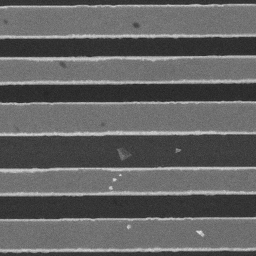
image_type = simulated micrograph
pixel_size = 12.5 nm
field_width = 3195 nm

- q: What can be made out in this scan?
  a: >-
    lines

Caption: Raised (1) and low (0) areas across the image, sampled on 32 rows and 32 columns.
00000000000000000000000000000000
11111111111111111111111111111111
11111111111111111111111111111111
11111111111111111111111111111111
11111111111111111111111111111111
00000000000000000000000000000000
00000000000000000000000000000000
11111111111111111111111111111111
11111111111111111111111111111111
11111111111111111111111111111111
11111111111110000000000000000000
00000000000000000000000000000000
00000000000000000000000000000000
11111111111111111111111111111111
11111111111111111111111111111111
11111111111111111111111111111111
11111111111111111111111111111111
00000000000000000000000000000000
00000000000000000000000000000000
00000000000000000000000000000000
00000000000000000000000000000000
11111111111111111111111111111111
11111111111111111111111111111111
11111111111111111111111111111111
00000000000000000000000000000000
00000000000000000000000000000000
00000000000000000000000000000000
11111111111111111111111111111111
11111111111111111111111111111111
11111111111111111111111111111111
11111111111111111111111111111111
00000000000000000000000000000000